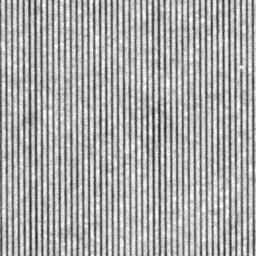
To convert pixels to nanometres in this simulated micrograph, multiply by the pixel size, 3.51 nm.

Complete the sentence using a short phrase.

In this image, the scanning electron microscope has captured parallel lines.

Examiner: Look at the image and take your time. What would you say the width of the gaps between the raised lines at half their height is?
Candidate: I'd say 11.4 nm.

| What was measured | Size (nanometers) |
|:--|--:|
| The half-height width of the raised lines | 8.8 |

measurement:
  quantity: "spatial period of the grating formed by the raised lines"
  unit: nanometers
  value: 20.6